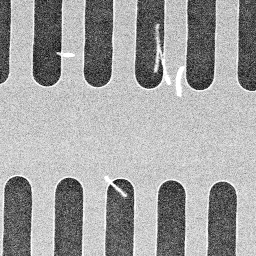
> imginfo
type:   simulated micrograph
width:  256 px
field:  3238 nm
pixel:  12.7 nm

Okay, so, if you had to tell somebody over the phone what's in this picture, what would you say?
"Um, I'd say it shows groups of lines, slits or small figures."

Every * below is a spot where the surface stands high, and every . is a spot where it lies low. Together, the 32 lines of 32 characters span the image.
.***....***...***....**....***..
.***....***...***....**....***..
.***....***...***....**....***..
.***....***...***....**....***..
.***....***...***....**....***..
.***....***...***....**....***..
.***....**....***....**....***..
.***....**....***...***....***..
.***....**....***...***....***..
.***....***...***...***....***..
*****..****..****...****..****..
********************************
********************************
********************************
********************************
********************************
********************************
********************************
********************************
********************************
********************************
********************************
*..*****..****..*****.**********
*...***...***....***...***...***
....***....**....***...***....**
....***...***....***...***....**
....***...***....***...***....**
....***...***....***...***....**
....***...***....***...***....**
....***...***....***...***....**
....***...***....**....***....**
....***...***....**....***....**